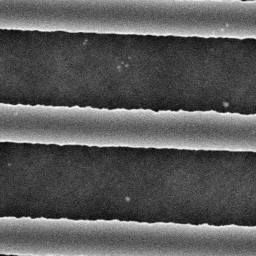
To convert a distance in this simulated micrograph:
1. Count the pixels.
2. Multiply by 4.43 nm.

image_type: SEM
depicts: lines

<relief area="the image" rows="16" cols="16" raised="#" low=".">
################
################
................
................
................
................
................
################
################
................
................
................
................
................
################
################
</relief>